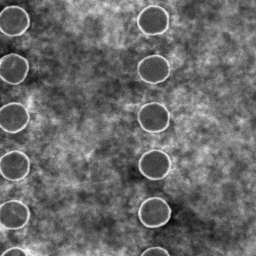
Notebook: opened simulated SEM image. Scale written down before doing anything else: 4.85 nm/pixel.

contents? raised bodies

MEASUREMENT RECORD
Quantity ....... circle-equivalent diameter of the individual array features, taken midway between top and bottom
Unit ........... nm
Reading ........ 147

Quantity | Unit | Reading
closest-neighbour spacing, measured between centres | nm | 230